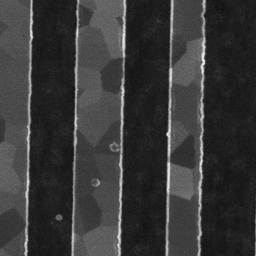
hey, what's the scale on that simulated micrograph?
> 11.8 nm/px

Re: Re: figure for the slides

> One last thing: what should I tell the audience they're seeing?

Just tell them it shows one or a few lines or trenches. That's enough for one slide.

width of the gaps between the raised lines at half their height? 543 nanometres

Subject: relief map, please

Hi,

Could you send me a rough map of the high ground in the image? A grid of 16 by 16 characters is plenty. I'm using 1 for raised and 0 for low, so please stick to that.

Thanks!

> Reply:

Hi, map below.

1100011100011000
1100011100011000
1100011100011000
1100011100011000
1100011100011000
1100011100011000
1100011100011000
1100011100011000
1100011100011000
1100011100011000
1100011100011000
1100011100111000
1100011100111000
1100011100110000
1100011000110000
1100011000110000